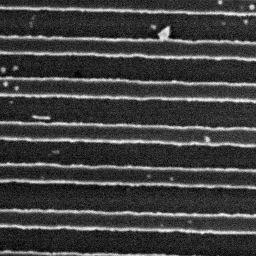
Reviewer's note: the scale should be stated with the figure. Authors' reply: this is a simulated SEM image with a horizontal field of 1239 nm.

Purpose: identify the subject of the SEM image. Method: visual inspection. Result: lines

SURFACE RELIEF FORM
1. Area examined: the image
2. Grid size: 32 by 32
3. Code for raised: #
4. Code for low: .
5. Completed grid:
################################
.................###############
................................
................................
....................#...........
################################
################################
..............................##
................................
................................
#############################...
################################
.......................#########
................................
................................
###########.....................
################################
...#############################
................................
................................
###.##..........................
################################
################################
...............................#
................................
................................
############....................
################################
...#.###########################
................................
................................
##.#............................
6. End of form